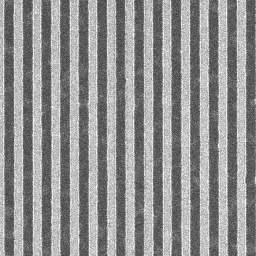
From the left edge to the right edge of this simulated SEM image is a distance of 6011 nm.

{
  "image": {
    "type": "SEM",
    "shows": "parallel lines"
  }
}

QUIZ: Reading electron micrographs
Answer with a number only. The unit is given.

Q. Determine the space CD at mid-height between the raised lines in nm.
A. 167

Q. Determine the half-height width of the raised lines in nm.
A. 270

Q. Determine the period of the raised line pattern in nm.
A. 436